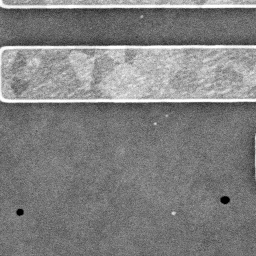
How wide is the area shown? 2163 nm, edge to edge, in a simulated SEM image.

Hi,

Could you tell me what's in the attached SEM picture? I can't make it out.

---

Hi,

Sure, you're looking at wiring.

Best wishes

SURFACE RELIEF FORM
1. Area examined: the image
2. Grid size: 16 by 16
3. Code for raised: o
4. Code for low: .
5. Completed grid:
................
................
................
oooooooooooooooo
oooooooooooooooo
oooooooooooooooo
................
................
................
................
................
................
................
................
................
................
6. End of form